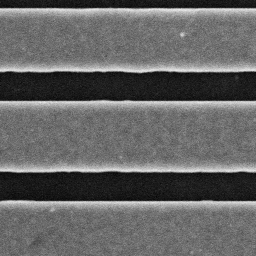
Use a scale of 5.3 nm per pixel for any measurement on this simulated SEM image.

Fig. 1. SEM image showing lines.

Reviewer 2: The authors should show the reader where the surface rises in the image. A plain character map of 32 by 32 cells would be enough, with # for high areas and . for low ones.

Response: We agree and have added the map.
................................
################################
################################
################################
################################
################################
################################
################################
################################
................................
................................
................................
................................
################################
################################
################################
################################
################################
################################
################################
################################
.######...###..###############.#
................................
................................
................................
################################
################################
################################
################################
################################
################################
################################